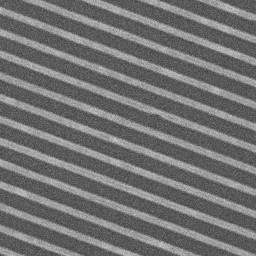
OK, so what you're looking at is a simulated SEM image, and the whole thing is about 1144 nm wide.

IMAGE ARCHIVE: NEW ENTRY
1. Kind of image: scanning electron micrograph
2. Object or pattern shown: parallel lines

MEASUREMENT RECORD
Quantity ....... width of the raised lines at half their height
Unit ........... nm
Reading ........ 23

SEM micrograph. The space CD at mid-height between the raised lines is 64.9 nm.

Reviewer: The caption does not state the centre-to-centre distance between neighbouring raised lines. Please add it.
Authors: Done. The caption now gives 91.3 nm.